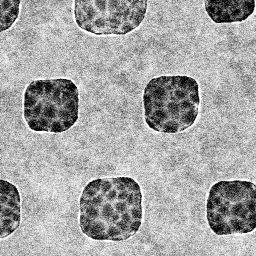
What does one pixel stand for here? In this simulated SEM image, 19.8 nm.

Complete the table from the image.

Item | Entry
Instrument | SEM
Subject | holes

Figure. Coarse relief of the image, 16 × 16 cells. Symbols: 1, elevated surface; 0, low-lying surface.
0111100001111000
0111100001111111
1111111111111111
1111111111111111
1111111111111111
1100011110001111
1000011110001111
1100011110001111
1111111111111111
1111111111111111
1111111111111111
0111110001111100
0111100001111000
0111100001111000
0111100011111000
1111111111111111